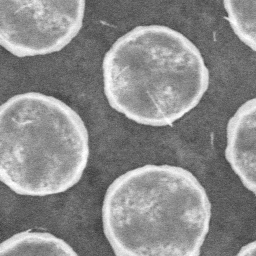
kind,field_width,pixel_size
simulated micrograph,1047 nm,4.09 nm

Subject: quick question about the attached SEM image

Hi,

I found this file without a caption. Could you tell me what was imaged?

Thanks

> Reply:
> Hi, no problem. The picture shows raised bodies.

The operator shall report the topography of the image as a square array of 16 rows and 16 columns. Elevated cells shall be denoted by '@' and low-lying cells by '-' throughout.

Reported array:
@@@@@---------@@
@@@@@----------@
@@@@----@@@@---@
-------@@@@@----
-------@@@@@@---
-------@@@@@@---
@@@@---@@@@@----
@@@@@---@@@----@
@@@@@---------@@
@@@@@---------@@
@@@@@----@@----@
@@@@---@@@@@---@
-------@@@@@@---
-------@@@@@@---
-------@@@@@@---
@@@@---@@@@@---@